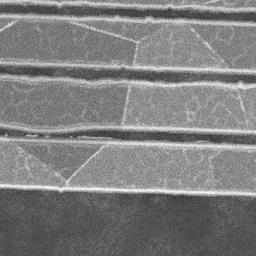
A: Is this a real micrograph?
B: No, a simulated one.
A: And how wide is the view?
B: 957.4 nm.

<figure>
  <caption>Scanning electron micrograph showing one or a few lines or trenches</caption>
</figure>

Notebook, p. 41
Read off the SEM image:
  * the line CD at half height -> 179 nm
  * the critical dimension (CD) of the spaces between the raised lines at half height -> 0.0528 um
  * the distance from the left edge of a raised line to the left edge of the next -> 0.23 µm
